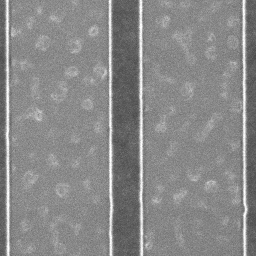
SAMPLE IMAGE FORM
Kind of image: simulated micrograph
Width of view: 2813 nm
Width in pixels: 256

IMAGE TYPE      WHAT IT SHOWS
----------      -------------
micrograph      one or a few lines or trenches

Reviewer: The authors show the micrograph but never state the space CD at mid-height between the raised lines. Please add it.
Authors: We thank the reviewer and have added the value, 1120 nm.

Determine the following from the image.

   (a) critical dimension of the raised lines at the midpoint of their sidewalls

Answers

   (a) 342 nm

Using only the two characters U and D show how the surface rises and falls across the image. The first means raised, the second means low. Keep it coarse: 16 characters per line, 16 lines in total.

DDDDDDDUUDDDDDDU
DDDDDDDUUDDDDDDU
DDDDDDDUUDDDDDDU
DDDDDDDUUDDDDDDU
DDDDDDDUUDDDDDDU
DDDDDDDUUDDDDDDU
DDDDDDDUUDDDDDDU
DDDDDDDUUDDDDDDU
DDDDDDDUUDDDDDDU
DDDDDDDUUDDDDDDU
DDDDDDDUUDDDDDDU
DDDDDDDUUDDDDDDU
UDDDDDDUUDDDDDDU
UDDDDDDUUDDDDDDU
UDDDDDDUUDDDDDDU
UDDDDDDUUDDDDDDU